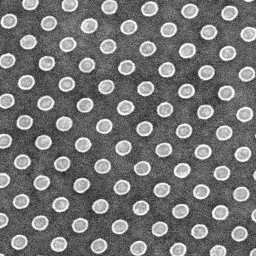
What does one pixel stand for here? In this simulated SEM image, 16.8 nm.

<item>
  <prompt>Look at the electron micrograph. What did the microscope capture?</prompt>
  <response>a regular array of raised bodies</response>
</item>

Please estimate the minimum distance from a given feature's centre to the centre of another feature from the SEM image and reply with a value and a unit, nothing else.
0.468 µm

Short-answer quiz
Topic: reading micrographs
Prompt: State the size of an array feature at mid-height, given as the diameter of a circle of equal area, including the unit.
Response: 240 nm